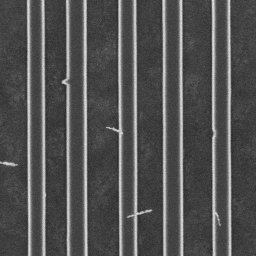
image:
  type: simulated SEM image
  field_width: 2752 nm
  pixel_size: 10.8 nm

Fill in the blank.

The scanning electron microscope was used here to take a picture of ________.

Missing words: parallel lines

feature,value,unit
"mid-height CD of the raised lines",177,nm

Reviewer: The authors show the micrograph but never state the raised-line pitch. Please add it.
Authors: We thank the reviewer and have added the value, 498 nanometers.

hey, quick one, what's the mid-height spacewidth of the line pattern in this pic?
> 324 nm